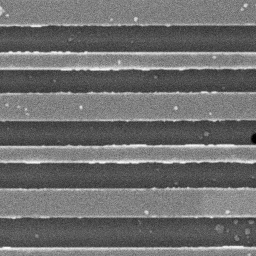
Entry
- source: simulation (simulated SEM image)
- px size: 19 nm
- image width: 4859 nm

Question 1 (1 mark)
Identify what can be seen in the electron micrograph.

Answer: lines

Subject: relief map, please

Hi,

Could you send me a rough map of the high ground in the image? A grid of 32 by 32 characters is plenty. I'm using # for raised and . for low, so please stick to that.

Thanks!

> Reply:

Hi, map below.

################################
################################
################################
................................
................................
................................
................................
################################
################################
................................
................................
................................
################################
################################
################################
................................
................................
................................
################################
################################
................................
................................
................................
................................
################################
################################
################################
................................
................................
................................
................................
################################